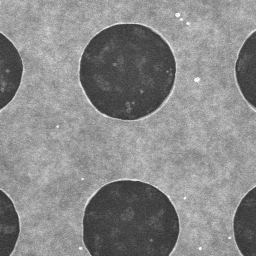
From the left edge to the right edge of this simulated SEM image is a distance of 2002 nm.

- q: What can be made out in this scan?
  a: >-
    holes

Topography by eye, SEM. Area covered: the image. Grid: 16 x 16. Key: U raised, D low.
UUUUUUUUUUUUUUUU
UUUUUUUUUUUUUUUU
DUUUUUDDDDUUUUUD
DUUUUDDDDDDUUUUD
DUUUUDDDDDDUUUUD
DUUUUDDDDDDUUUUD
UUUUUUDDDDUUUUUU
UUUUUUUUUUUUUUUU
UUUUUUUUUUUUUUUU
UUUUUUUUUUUUUUUU
UUUUUUUUUUUUUUUU
UUUUUUUDDUUUUUUU
DUUUUUDDDDDUUUUD
DUUUUDDDDDDUUUUD
DUUUUDDDDDDUUUUD
DUUUUDDDDDDUUUUD